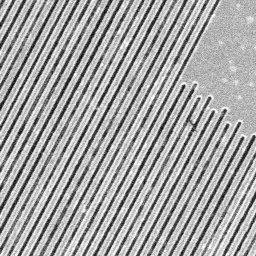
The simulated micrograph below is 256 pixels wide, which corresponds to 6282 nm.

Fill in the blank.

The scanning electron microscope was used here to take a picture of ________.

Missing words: parallel lines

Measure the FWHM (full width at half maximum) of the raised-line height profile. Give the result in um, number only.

0.119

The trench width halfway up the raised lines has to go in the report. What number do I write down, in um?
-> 0.119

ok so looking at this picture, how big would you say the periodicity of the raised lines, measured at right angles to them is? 234 nm